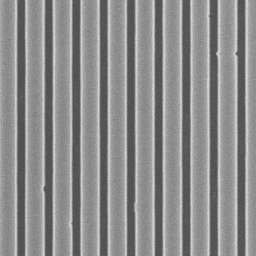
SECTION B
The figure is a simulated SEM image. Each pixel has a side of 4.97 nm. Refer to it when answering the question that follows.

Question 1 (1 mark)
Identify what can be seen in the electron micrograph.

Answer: parallel lines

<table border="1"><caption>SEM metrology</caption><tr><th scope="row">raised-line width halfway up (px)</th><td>18.5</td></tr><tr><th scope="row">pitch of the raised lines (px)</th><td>27.5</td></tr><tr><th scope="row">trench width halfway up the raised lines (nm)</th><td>46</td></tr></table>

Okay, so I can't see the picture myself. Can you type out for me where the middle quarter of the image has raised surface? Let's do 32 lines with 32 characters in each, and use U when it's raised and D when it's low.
UUDDUUUUUDDUUUUDDDUUUUDDDUUUUDDD
UUDDUUUUUDDUUUUUDDUUUUDDDUUUUDDD
UUDDUUUUUDDUUUUUDDUUUUDDDUUUUDDD
UUDDUUUUUDDUUUUUDDUUUUDDDUUUUDDD
UUDDUUUUUDDUUUUUDDUUUUDDDUUUUDDD
UUDDUUUUUDDUUUUDDDUUUUDDDUUUUDDD
UUDDUUUUUDDUUUUDDDUUUUDDDUUUUDDD
UUDDUUUUUDDUUUUDDDUUUUDDDUUUUDDD
UUDDUUUUUDDUUUUDDDUUUUDDDUUUUDDD
UUDDUUUUUDDUUUUDDDUUUUDDDUUUUDDD
UUDDUUUUUDDUUUUDDDUUUUDDDUUUUDDD
UUDDUUUUUDDUUUUDDDUUUUDDDUUUUDDD
UUDDUUUUUDDUUUUDDDUUUUDDDUUUUDDD
UUDDUUUUUDDUUUUDDDUUUUDDDUUUUDDD
UUDDUUUUUDDUUUUDDDUUUUDDDUUUUDDD
UUDDUUUUUDDUUUUDDDUUUUDDDUUUUDDD
UUDDUUUUUDDUUUUDDDUUUUDDDUUUUDDD
UUDDUUUUUDDUUUUDDDUUUUDDDUUUUDDD
UUDDUUUUUDDUUUUDDDUUUUDDDUUUUDDD
UUDDUUUUUDDUUUUDDDUUUUDDDUUUUDDD
UUDDUUUUUDDUUUUDDDUUUUDDDUUUUDDD
UUDDUUUUUDDUUUUDDDUUUUDDDUUUUDDD
UUDDUUUUUDDUUUUDDDUUUUDDDUUUUDDD
UUDDUUUUUDDUUUUUDDUUUUDDDUUUUDDD
UUDDUUUUUDDUUUUDDDUUUUDDDUUUUDDD
UUDDUUUUUDDUUUUUDDUUUUDDDUUUUDDD
UUDDUUUUUDDUUUUUDDUUUUDDDUUUUDDD
UUDDUUUUUDDUUUUDDDUUUUDDDUUUUDDD
UUDDUUUUUDDUUUUDDDUUUUUDDUUUUDDD
UUDDUUUUUDDUUUUDDDUUUUUDDUUUUDDD
UUDDUUUUUDDUUUUUDDUUUUUDDUUUUDDD
UUDDUUUUUDDUUUUUDDUUUUDDDUUUUDDD